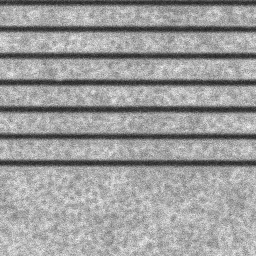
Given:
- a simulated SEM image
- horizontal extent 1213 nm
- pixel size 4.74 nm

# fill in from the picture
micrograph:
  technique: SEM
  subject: parallel lines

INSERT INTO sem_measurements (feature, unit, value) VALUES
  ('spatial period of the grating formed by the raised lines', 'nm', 127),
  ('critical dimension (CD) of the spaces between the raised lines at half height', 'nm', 37.9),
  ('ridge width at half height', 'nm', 89.4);